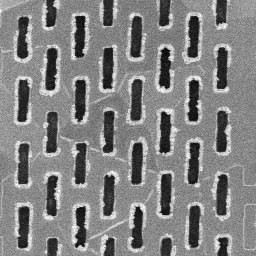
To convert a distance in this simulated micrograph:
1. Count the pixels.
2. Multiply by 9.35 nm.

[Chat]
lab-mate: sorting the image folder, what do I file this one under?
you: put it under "a regular array of holes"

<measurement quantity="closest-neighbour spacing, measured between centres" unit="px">41.8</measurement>